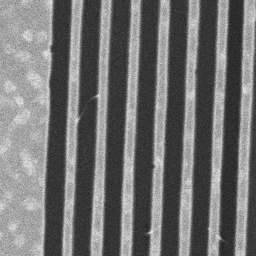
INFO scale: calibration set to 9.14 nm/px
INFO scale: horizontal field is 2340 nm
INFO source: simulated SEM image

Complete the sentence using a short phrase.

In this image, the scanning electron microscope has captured parallel lines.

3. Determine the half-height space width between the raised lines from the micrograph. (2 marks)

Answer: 0.162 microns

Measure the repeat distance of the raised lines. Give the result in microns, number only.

0.264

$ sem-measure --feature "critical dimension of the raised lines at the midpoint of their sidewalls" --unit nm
108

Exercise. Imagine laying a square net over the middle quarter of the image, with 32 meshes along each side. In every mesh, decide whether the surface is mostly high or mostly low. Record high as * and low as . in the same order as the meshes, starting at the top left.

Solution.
.***.....**.....***....***.....*
.***.....**.....***....***....**
.***.....**.....***....***....**
.***.....**.....***....***....**
.***.....**.....**.....***....**
.***....***.....**.....***....**
.***....***.....**.....***....**
.***....***.....**.....***....**
.***....***.....**.....***....**
.***....***.....**.....***....**
.***....***.....**.....***....**
.***....***....***.....***....**
.***....***....***.....***....**
.***....***....***.....***....**
.**.....***....***.....***....**
.**.....***....***.....**.....**
.**.....***....***....***.....**
.**.....***....***....***.....**
.**.....**.....***.....**.....**
.**.....**.....***.....**.....**
***.....**.....***.....**.....**
***.....**.....***....***.....**
***.....**.....***....***.....**
.**.....**.....***....***.....**
.**.....**.....**.....***.....**
***.....**.....**......**.....**
***.....**.....**.....***....***
***.....**.....**.....***....***
***.....**.....***....***....***
***.....**.....**.....***....***
***....***.....**.....***....***
***....***.....**.....***....***